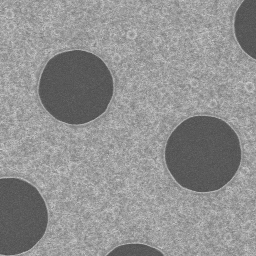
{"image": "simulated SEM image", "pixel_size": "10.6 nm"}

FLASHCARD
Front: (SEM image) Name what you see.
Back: holes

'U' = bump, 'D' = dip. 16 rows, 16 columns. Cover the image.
UUUUUUUUUUUUUUUD
UUUUUUUUUUUUUUUD
UUUUUUUUUUUUUUUD
UUUDDDUUUUUUUUUU
UUUDDDDUUUUUUUUU
UUDDDDDUUUUUUUUU
UUUDDDDUUUUUUUUU
UUUUDDUUUUUUDDUU
UUUUUUUUUUUDDDDU
UUUUUUUUUUDDDDDU
UUUUUUUUUUUDDDDU
DDUUUUUUUUUDDDUU
DDDUUUUUUUUUUUUU
DDDUUUUUUUUUUUUU
DDDUUUUUUUUUUUUU
DDUUUUUDDDUUUUUU